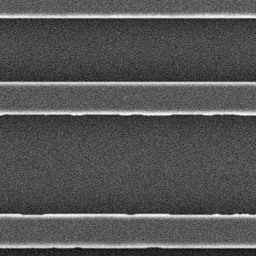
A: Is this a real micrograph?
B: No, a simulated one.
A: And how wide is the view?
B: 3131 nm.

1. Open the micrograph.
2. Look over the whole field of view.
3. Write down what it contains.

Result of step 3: lines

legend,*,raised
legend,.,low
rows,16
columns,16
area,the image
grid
****************
................
................
................
................
****************
****************
................
................
................
................
................
................
****************
****************
................